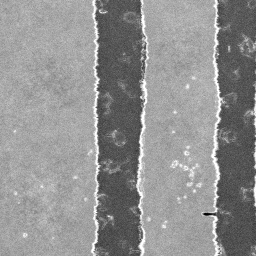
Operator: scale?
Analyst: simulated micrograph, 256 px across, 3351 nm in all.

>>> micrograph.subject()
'one or a few lines or trenches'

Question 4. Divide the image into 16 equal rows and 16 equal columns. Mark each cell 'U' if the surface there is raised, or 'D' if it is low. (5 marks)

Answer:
UUUUUUDDDUUUUUDD
UUUUUUDDDUUUUUDD
UUUUUUDDDUUUUDDD
UUUUUUDDDUUUUDDD
UUUUUUDDDUUUUDDD
UUUUUUDDDUUUUUDD
UUUUUUDDDUUUUUDD
UUUUUUDDDUUUUUDD
UUUUUUDDDUUUUDDD
UUUUUUDDDUUUUDDD
UUUUUUDDDUUUUUDD
UUUUUUDDDUUUUUDD
UUUUUUDDDUUUUDDD
UUUUUUDDDUUUUDDD
UUUUUUDDDUUUUDDD
UUUUUUDDDUUUUDDD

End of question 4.